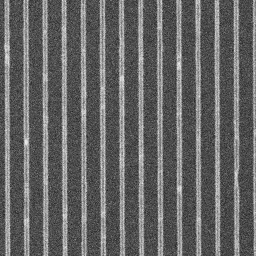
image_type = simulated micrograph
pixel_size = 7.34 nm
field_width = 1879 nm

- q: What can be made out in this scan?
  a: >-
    parallel lines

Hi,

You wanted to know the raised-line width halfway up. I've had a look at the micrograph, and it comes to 28.5 nm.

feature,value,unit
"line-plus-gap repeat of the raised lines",0.14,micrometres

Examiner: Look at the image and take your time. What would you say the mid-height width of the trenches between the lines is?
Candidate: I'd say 113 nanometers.